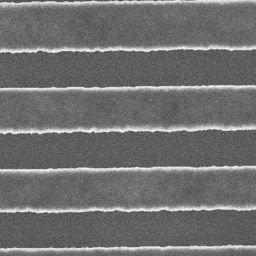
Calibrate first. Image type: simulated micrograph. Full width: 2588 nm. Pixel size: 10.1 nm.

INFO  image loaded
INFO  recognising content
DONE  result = lines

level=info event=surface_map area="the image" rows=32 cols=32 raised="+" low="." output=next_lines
++++++++++++++++++++++++++++++++
++++++++++++++++++++++++++++++++
++++++++++++++++++++++++++++++++
++++++++++++++++++++++++++++++++
++++++++++++++++++++++++++++++++
++++++++++++++++++++++++++++++++
++++..+.........................
................................
................................
................................
................................
++++++++++++++++++++++++++++++++
++++++++++++++++++++++++++++++++
++++++++++++++++++++++++++++++++
++++++++++++++++++++++++++++++++
++++++++++++++++++++++++++++++++
++++++.++.......................
................................
................................
................................
................................
++++++++++++++++++++++++++++++++
++++++++++++++++++++++++++++++++
++++++++++++++++++++++++++++++++
++++++++++++++++++++++++++++++++
++++++++++++++++++++++++++++++++
....++++........................
................................
................................
................................
................................
++++++++++++++++++++++++++++++++